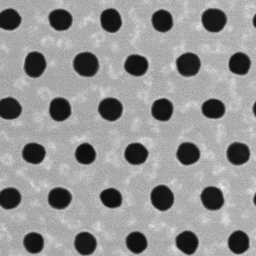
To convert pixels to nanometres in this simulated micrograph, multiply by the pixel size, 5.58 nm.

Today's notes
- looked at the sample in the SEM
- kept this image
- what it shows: a regular array of holes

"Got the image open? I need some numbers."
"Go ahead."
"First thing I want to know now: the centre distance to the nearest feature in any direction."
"282 nanometres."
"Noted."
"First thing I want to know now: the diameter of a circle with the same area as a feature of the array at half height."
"126 nanometres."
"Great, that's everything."